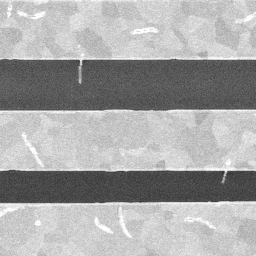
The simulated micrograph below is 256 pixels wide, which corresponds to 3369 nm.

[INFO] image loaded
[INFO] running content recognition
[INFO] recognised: lines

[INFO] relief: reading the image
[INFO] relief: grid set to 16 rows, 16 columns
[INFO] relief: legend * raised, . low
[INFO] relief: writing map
****************
****************
****************
****************
................
................
................
****************
****************
****************
****************
................
................
****************
****************
****************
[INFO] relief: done